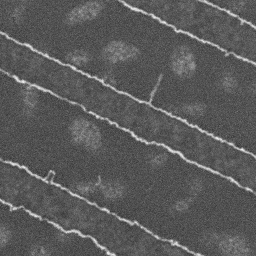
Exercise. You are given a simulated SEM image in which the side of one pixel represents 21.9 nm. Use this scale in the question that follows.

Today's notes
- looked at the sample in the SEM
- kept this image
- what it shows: one or a few lines or trenches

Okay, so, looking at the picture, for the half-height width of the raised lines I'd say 32.9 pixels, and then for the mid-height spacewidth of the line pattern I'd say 1.76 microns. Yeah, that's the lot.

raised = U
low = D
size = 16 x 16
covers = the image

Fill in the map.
DDDDDDDDUUUUUUDD
DDDDDDDDDDUUUUUU
UDDDDDDDDDDDDUUU
UUUDDDDDDDDDDDDU
UUUUUDDDDDDDDDDD
DDUUUUUDDDDDDDDD
DDDDDUUUUDDDDDDD
DDDDDDDUUUUDDDDD
DDDDDDDDUUUUUDDD
DDDDDDDDDDDUUUUD
UDDDDDDDDDDDDUUU
UUUUDDDDDDDDDDDU
UUUUUDDDDDDDDDDD
DDUUUUUDDDDDDDDD
DDDDDUUUUDDDDDDD
DDDDDDUUUUUDDDDD